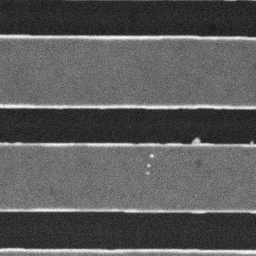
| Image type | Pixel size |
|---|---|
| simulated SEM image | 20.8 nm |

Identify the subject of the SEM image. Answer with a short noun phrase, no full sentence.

lines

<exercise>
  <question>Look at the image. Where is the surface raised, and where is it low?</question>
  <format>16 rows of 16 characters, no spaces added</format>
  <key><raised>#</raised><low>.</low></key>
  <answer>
................
................
################
################
################
################
################
................
................
################
################
################
################
................
................
................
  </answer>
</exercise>